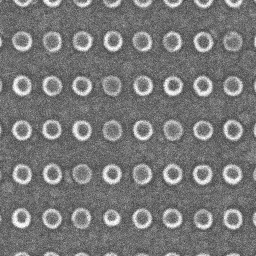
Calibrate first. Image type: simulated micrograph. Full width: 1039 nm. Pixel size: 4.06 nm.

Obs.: a regular array of raised bodies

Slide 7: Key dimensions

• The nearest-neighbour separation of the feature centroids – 121 nm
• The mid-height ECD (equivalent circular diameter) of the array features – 77.1 nm